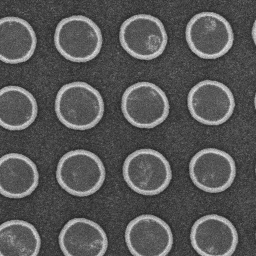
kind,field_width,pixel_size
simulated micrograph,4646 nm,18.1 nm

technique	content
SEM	a regular array of raised bodies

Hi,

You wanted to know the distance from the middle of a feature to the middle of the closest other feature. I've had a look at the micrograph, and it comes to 1190 nm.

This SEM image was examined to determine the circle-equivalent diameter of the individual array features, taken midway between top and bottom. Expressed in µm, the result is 0.789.